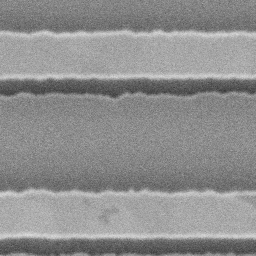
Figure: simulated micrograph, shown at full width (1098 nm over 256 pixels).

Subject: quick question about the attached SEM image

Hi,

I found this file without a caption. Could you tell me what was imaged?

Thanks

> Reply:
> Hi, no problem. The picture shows lines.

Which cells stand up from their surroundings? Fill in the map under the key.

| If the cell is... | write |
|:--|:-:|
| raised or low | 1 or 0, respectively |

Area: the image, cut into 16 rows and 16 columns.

0000000000000000
0000000000000000
1111111111111111
1111111111111111
1111111111111111
0000000000000000
0000000000000000
0000000000000000
0000000000000000
0000000000000000
0000000000000000
0000000000000000
1111111111111111
1111111111111111
1111111111111111
0000000000000000